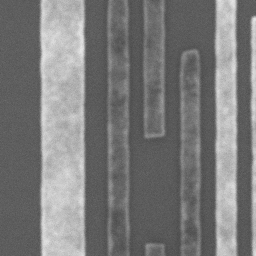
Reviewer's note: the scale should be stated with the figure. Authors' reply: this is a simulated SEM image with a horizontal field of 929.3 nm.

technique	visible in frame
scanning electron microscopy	wiring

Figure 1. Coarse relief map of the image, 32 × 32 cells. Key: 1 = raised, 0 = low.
00000111110000110011000000011000
00000111110000110011000000011000
00000111110000110011000000011000
00000111110000110011000000011000
00000111110000110011000000011000
00000111110000110011000000011000
00000111110000110011000110011000
00000111110000110011000110011000
00000111110000110011000110011000
00000111110000110011000110011000
00000111110000110011000110011000
00000111110000110011000110011000
00000111110000110011000110011000
00000111110000110011000110011000
00000111110000110011000110011000
00000111110000110011000110011000
00000111110000110011000110011000
00000111110000110000000110011000
00000111110000110000000110011000
00000111110000110000000110011000
00000111110000110000000110011000
00000111110000110000000110011000
00000111110000110000000110011000
00000111110000110000000110011000
00000111110000110000000110011000
00000111110000110000000110011000
00000111110000110000000110011000
00000111110000110000000110011000
00000111110000110000000110011000
00000111110000110000000110011000
00000111110000110000000110011000
00000111110000110011000110011000